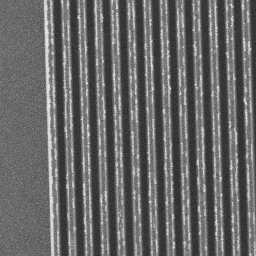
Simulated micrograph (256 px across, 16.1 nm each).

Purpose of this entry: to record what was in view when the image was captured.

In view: parallel lines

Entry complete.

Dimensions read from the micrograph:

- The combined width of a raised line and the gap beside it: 263 nanometres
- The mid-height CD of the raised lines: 125 nm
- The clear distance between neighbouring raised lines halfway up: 8.74 pixels